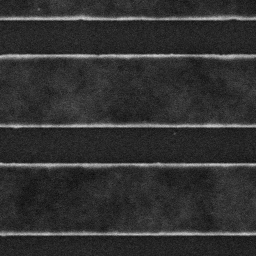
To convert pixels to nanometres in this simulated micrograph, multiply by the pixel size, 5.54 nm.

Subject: lines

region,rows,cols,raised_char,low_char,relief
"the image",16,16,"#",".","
################
................
................
################
################
################
################
################
................
................
################
################
################
################
################
................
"